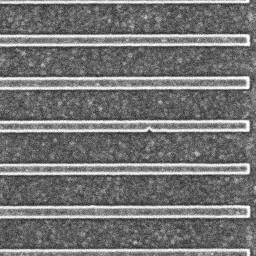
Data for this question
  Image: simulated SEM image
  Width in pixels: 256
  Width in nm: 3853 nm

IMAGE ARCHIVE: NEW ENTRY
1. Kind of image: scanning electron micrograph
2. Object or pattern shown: parallel lines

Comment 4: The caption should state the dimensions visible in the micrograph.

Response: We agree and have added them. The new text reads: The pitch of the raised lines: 645 nm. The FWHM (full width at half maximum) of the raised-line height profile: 145 nm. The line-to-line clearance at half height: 498 nm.